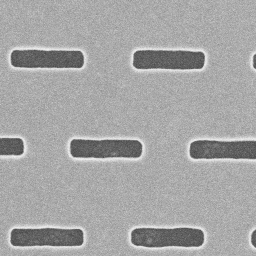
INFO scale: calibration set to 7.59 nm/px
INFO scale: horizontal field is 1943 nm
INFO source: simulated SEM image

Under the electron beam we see holes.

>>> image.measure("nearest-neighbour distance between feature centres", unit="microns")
0.816